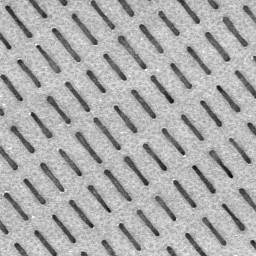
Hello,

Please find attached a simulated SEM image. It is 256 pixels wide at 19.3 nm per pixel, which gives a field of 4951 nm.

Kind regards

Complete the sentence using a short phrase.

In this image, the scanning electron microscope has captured a regular array of holes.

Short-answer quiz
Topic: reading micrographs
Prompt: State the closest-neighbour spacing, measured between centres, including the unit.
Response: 449 nm